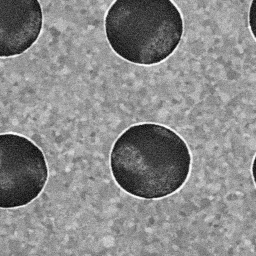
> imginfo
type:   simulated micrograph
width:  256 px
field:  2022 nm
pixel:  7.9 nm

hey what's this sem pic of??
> holes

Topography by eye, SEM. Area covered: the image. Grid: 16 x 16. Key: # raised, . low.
...####....#####
...####....#####
..#####....#####
.#######...#####
################
################
################
################
.######....#####
...####.....####
...####.....####
...####....#####
..##############
################
################
################